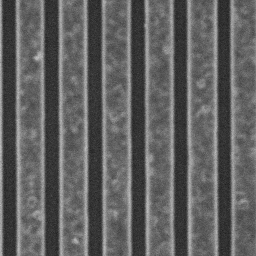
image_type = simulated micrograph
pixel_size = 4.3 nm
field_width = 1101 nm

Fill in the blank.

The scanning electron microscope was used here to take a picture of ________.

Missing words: parallel lines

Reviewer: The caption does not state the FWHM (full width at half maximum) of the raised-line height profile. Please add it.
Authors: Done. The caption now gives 115 nanometers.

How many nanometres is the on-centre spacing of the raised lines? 185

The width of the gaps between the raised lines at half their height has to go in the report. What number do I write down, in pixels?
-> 16.2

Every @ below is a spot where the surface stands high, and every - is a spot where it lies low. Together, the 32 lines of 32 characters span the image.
--@@@--@@@@--@@@--@@@@--@@@--@@@
--@@@--@@@@--@@@--@@@---@@@--@@@
--@@@--@@@@--@@@--@@@---@@@--@@@
--@@@---@@@--@@@--@@@@--@@@--@@@
--@@@---@@@--@@@--@@@@--@@@--@@@
--@@@---@@@--@@@--@@@@--@@@--@@@
--@@@---@@@--@@@--@@@@--@@@--@@@
--@@@---@@@--@@@--@@@---@@@--@@@
--@@@---@@@--@@@--@@@---@@@--@@@
--@@@---@@@--@@@--@@@@--@@@--@@@
--@@@---@@@--@@@--@@@@--@@@--@@@
--@@@---@@@--@@@--@@@@--@@@--@@@
--@@@---@@@--@@@--@@@@--@@@--@@@
--@@@---@@@--@@@--@@@@--@@@--@@@
--@@@---@@@--@@@--@@@@--@@@--@@@
--@@@---@@@--@@@--@@@@--@@@--@@@
--@@@---@@@--@@@--@@@@--@@@--@@@
--@@@---@@@--@@@--@@@@--@@@--@@@
--@@@---@@@--@@@--@@@@--@@@--@@@
--@@@---@@@--@@@--@@@@--@@@--@@@
--@@@---@@@--@@@--@@@@--@@@--@@@
--@@@---@@@--@@@--@@@@--@@@--@@@
--@@@---@@@--@@@--@@@@--@@@--@@@
--@@@---@@@--@@@--@@@@--@@@--@@@
--@@@---@@@--@@@--@@@@--@@@--@@@
--@@@---@@@--@@@--@@@@--@@@--@@@
--@@@---@@@--@@@--@@@@--@@@--@@@
--@@@---@@@--@@@--@@@@--@@@--@@@
--@@@---@@@--@@@--@@@@--@@@--@@@
--@@@---@@@--@@@--@@@@--@@@--@@@
--@@@---@@@--@@@--@@@@--@@@--@@@
--@@@---@@@--@@@--@@@@--@@@--@@@